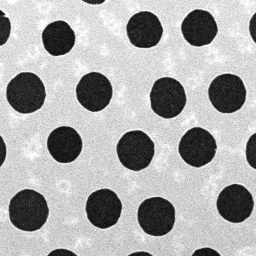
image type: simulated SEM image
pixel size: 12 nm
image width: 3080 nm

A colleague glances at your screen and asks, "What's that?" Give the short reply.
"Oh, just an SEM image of a regular array of holes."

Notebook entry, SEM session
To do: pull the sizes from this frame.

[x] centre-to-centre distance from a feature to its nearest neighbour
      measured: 722 nm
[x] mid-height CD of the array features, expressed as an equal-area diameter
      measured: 463 nanometers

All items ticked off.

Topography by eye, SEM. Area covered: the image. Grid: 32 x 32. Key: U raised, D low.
UUUUUUUUUUUDUUUUUUUUUUUUUUUUUUUU
UUUUUUUUUUUUUUUUUDDUUUUUDDUUUUUU
DUUUUUUUUUUUUUUUDDDDUUUDDDDUUUUD
DUUUUUDDDUUUUUUUDDDDUUUDDDDUUUUD
DUUUUDDDDUUUUUUUDDDDUUUDDDDUUUUD
UUUUUDDDDUUUUUUUUDDDUUUUDDUUUUUU
UUUUUUDDDUUUUUUUUUUUUUUUUUUUUUUU
UUUUUUUUUUUUUUUUUUUUUUUUUUUUUUUU
UUUUUUUUUUUUUUUUUUUUUUUUUUUUUUUU
UUDDDUUUUUDDDUUUUUUUUUUUUUUDDDUU
UDDDDUUUUUDDDDUUUUUDDDDUUUDDDDUU
UDDDDDUUUDDDDDUUUUUDDDDUUUDDDDDU
UDDDDDUUUUDDDDUUUUUDDDDUUUDDDDDU
UUDDDUUUUUUDDUUUUUUDDDDUUUUDDDUU
UUUUUUUUUUUUUUUUUUUUDDUUUUUUUUUU
UUUUUUUUUUUUUUUUUUUUUUUUUUUUUUUU
UUUUUUDDDDUUUUUUDDUUUUUDDDUUUUUU
UUUUUUDDDDUUUUUDDDDUUUUDDDDUUUUD
DUUUUUDDDDUUUUUDDDDUUUDDDDDUUUUD
DUUUUUDDDDUUUUUDDDDUUUUDDDDUUUUD
UUUUUUUUUUUUUUUDDDDUUUUDDDUUUUUD
UUUUUUUUUUUUUUUUUUUUUUUUUUUUUUUU
UUUUUUUUUUUUUUUUUUUUUUUUUUUUUUUU
UUUUUUUUUUUUUUUUUUUUUUUUUUUUDDDU
UUDDDUUUUUUDDDDUUUUUUUUUUUUDDDDD
UDDDDDUUUUUDDDDUUUDDDUUUUUUDDDDD
UDDDDDUUUUUDDDDUUDDDDDUUUUUDDDDU
UDDDDDUUUUUDDDDUUDDDDDUUUUUUDDDU
UUDDDUUUUUUUDUUUUUDDDDUUUUUUUUUU
UUUUUUUUUUUUUUUUUUUDUUUUUUUUUUUU
UUUUUUUUUUUUUUUUUUUUUUUUUUUUUUUU
UUUUUUDDDUUUUUUUUDUUUUUUDDDUUUUU